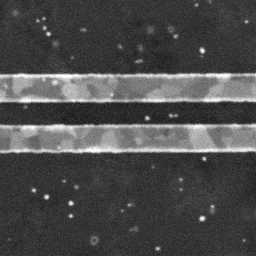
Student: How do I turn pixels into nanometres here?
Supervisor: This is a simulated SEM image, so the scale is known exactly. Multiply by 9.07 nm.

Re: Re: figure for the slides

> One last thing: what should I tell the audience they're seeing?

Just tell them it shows lines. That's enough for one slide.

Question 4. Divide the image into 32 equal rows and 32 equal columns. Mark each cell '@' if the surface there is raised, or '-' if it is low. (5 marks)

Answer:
--------------------------------
--------------------------------
--------------------------------
--------------------------------
--------------------------------
--------------------------------
--------------------------------
--------------------------------
--------------------------------
@@@@@@@@@@@@@@@@@@@@@@@@@@@@@@@@
@@@@@@@@@@@@@@@@@@@@@@@@@@@@@@@@
@@@@@@@@@@@@@@@@@@@@@@@@@@@@@@@@
@@@@@@@@@@@@@@@@@@@@@@@@@@@@@@@@
--------------------------------
--------------------------------
--------------------------------
@@@@@@@@@@@@@@@@@@@@@@@@@@@@@@@@
@@@@@@@@@@@@@@@@@@@@@@@@@@@@@@@@
@@@@@@@@@@@@@@@@@@@@@@@@@@@@@@@@
--------------------------------
--------------------------------
--------------------------------
--------------------------------
--------------------------------
--------------------------------
--------------------------------
--------------------------------
--------------------------------
--------------------------------
--------------------------------
--------------------------------
--------------------------------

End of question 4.